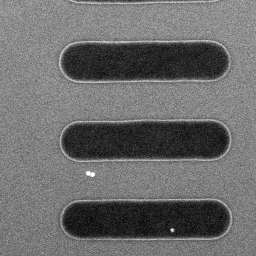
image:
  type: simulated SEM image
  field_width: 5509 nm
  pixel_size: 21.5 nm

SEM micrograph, groups of lines, slits or small figures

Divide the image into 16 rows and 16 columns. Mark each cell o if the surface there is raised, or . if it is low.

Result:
................
................
................
....oooooooooo..
....oooooooooo..
................
................
............o...
....oooooooooo..
....oooooooooo..
................
................
..........ooo...
....oooooooooo..
....oooooooooo..
................